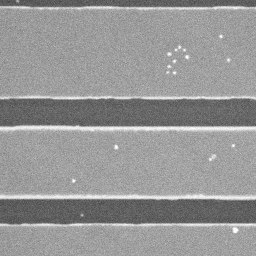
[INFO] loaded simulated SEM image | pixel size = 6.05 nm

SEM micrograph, lines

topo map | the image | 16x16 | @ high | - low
@@---@@@-----@@@
@@@@@@@@@@@@@@@@
@@@@@@@@@@@@@@@@
@@@@@@@@@@@@@@@@
@@@@@@@@@@@@@@@@
@@@@@@@@@@@@@@@@
----------------
----------------
@@@@@@@@@@@@@@@@
@@@@@@@@@@@@@@@@
@@@@@@@@@@@@@@@@
@@@@@@@@@@@@@@@@
----------------
----------------
@@@@@@@@@@@@@@@@
@@@@@@@@@@@@@@@@